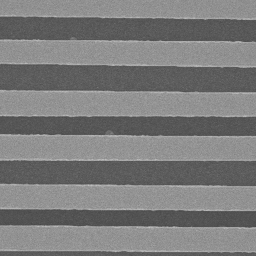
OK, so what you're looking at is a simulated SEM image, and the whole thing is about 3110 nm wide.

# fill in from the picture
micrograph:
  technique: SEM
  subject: lines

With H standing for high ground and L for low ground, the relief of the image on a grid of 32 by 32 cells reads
HHHHHHHHHHHHHHHHHHHHHHHHHHHHHHHH
HHHHHHHHHHHHHHHHHHHHHHHHHHHHHHHH
LLLLLLLLLLLLLLLLLLLLLLLLLLLLLLLL
LLLLLLLLLLLLLLLLLLLLLLLLLLLLLLLL
LLLLLLLLLLLLLLLLLLLLLLLLLLLLLLLL
HHHHHHHHHHHHHHHHHHHHHHHHHHHHHHHH
HHHHHHHHHHHHHHHHHHHHHHHHHHHHHHHH
HHHHHHHHHHHHHHHHHHHHHHHHHHHHHHHH
LLLLLLLLLLLLLLLLLLLLLLLLLLLLLLLL
LLLLLLLLLLLLLLLLLLLLLLLLLLLLLLLL
LLLLLLLLLLLLLLLLLLLLLLLLLLLLLLLL
HHHHHHHHHHHHHHLLLLLLLLLLLLLLLLLL
HHHHHHHHHHHHHHHHHHHHHHHHHHHHHHHH
HHHHHHHHHHHHHHHHHHHHHHHHHHHHHHHH
LLLHLHLLHHLHLLLLHHLLLHLHHHHHHHHH
LLLLLLLLLLLLLLLLLLLLLLLLLLLLLLLL
LLLLLLLLLLLLLLLLLLLLLLLLLLLLLLLL
HHHHHHHHHHHHHHHHHHHHHHHHHHHHHHHH
HHHHHHHHHHHHHHHHHHHHHHHHHHHHHHHH
HHHHHHHHHHHHHHHHHHHHHHHHHHHHHHHH
LLLLLLLLLLLLLLLLLLLLLLLLLLLLLLLL
LLLLLLLLLLLLLLLLLLLLLLLLLLLLLLLL
LLLLLLLLLLLLLLLLLLLLLLLLLLLLLLLL
HHHHHHHHHHHHHHHHHHHHHHHHHHHHHHHH
HHHHHHHHHHHHHHHHHHHHHHHHHHHHHHHH
HHHHHHHHHHHHHHHHHHHHHHHHHHHHHHHH
LLLLLLLLLLLLLLLLLLLLLLLLLLLLLLLL
LLLLLLLLLLLLLLLLLLLLLLLLLLLLLLLL
HHHHHHHHHHHHHHHHHHHHHHHHHHHHHHHH
HHHHHHHHHHHHHHHHHHHHHHHHHHHHHHHH
HHHHHHHHHHHHHHHHHHHHHHHHHHHHHHHH
LLLLLLLLLLLLLLLLLLLLLLLLLLLHHHHH